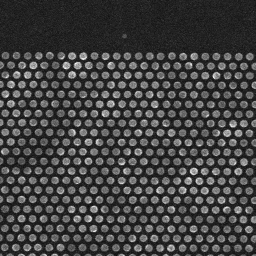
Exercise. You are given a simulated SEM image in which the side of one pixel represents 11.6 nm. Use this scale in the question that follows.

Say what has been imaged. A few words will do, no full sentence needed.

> a regular array of raised bodies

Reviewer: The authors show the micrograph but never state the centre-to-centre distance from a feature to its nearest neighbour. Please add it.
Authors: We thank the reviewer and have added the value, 10.8 pixels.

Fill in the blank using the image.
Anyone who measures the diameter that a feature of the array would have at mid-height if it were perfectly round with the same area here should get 82.8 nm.